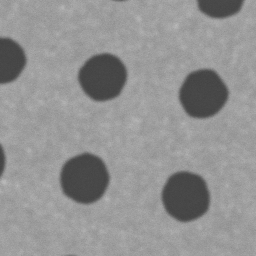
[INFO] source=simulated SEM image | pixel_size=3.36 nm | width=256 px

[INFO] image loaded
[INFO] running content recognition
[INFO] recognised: holes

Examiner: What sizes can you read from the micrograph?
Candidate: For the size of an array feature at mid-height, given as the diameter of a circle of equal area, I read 165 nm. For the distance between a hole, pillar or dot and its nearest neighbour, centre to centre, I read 0.344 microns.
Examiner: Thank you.